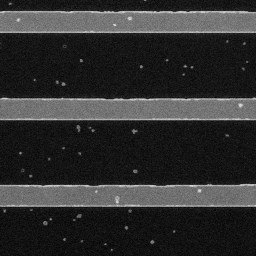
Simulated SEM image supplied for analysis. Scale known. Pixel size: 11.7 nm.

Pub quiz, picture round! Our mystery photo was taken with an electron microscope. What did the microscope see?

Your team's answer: lines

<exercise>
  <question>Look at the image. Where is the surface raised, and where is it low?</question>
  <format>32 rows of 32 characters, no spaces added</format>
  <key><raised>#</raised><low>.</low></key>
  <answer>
................................
###############################.
################################
################################
................................
................................
................................
................................
................................
................................
................................
................................
################################
################################
################################
................................
................................
................................
................................
................................
................................
................................
................................
################################
################################
################################
................................
................................
................................
................................
................................
................................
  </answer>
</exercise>